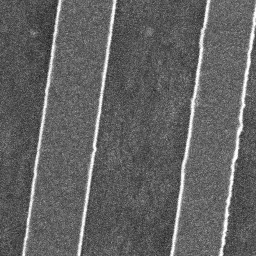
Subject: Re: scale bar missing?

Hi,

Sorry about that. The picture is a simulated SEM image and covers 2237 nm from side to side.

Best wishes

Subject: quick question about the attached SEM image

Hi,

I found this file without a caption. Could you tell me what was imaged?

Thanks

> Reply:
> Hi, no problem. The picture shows one or a few lines or trenches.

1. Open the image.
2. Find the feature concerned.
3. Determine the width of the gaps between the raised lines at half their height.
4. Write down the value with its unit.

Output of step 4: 795 nanometres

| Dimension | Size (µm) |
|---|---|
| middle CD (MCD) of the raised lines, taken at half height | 0.478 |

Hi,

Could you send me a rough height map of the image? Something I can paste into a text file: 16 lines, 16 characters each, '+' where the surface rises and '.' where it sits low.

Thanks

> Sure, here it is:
....+++......+++
....+++......+++
...++++......+++
...++++......+++
...++++.....+++.
...+++......+++.
...+++......+++.
...+++......+++.
...+++......+++.
..++++......+++.
..++++.....++++.
..++++.....+++..
..+++......+++..
..+++......+++..
..+++......+++..
..+++......+++..